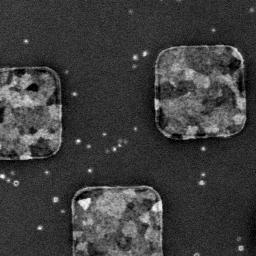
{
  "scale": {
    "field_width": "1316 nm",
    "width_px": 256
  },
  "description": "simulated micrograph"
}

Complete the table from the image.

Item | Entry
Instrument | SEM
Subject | raised bodies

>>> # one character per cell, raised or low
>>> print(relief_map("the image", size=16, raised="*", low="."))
................
................
................
..........*****.
***.......*****.
****......*****.
****......*****.
****......*****.
****......****..
***.............
................
................
.....*****......
.....*****......
.....*****......
.....*****......